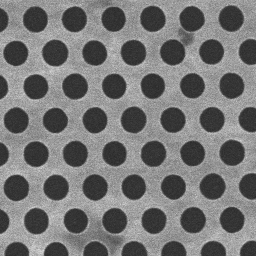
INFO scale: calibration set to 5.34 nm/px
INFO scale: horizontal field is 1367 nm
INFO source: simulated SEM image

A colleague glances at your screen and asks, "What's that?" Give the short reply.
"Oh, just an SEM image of a regular array of holes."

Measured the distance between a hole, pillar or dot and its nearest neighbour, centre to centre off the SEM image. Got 207 nm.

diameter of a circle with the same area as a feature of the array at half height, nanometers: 135